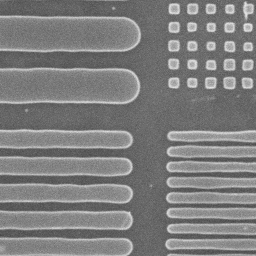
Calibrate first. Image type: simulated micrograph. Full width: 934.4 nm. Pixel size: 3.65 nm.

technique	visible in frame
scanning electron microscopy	groups of lines, slits or small figures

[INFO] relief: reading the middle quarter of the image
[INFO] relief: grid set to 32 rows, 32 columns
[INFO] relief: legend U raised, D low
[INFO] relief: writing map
DDDDDDDDDDDDDDDDDDDDDDDDDDUUDDDU
DUUUUUUDDUUUUUUDDDDDDDDDDDDDDDDD
UUUUUUUUUUUUUUUUUDDDDDDDDDDDDDDD
UUUUUUUUUUUUUUUUUUDDDDDDDDDDDDDD
UUUUUUUUUUUUUUUUUUUDDDDDDDUUUDDU
UUUUUUUUUUUUUUUUUUUDDDDDDDUUUDDU
UUUUUUUUUUUUUUUUUUUDDDDDDDDDDDDD
UUUUUUUUUUUUUUUUUUDDDDDDDDDDDDDD
UUUUUUUUUUUUUUUUUUDDDDDDDDDDDDDD
UUUUUUUUUUUUUUUUDDDDDDDDDDDDDDDD
DDDDDDDDDDDDDDDDDDDDDDDDDDDDDDDD
DDDDDDDDDDDDDDDDDDDDDDDDDDDDDDDD
DDDDDDDDDDDDDDDDDDDDDDDDDDDDDDDD
DDDDDDDDDDDDDDDDDDDDDDDDDDDDDDDD
DDDDDDDDDDDDDDDDDDDDDDDDDDDDDDDD
DDDDDDDDDDDDDDDDDDDDDDDDDDDDDDDD
DDDDDDDDDDDDDDDDDDDDDDDDDDDDDDDD
UUUUUUUUUUUUUUUUDDDDDDDDDDUUUUUU
UUUUUUUUUUUUUUUUUDDDDDDDDDUUUUUU
UUUUUUUUUUUUUUUUUDDDDDDDDDDDDDDD
UUUUUUUUUUUUUUUUDDDDDDDDDDDDDDDD
DDDDDDDDDDDDDDDDDDDDDDDDDDUUUUUU
DDDDDDDDDDDDDDDDDDDDDDDDDDUUUUUU
DDDDDDDDDDDDDDDDDDDDDDDDDDDDDDDD
UUUUUUUUUUUUUUUUDDDDDDDDDDDDDDUU
UUUUUUUUUUUUUUUUUDDDDDDDDDUUUUUU
UUUUUUUUUUUUUUUUUDDDDDDDDDUUUUUU
UUUUUUUUUUUUUUUUDDDDDDDDDDDDDDDD
DDDDDDDDDDDDDDDDDDDDDDDDDDDDDDDD
DDDDDDDDDDDDDDDDDDDDDDDDDDUUUUUU
UUUDDDUUUUUUUUUDDDDDDDDDDDUUUUUU
UUUUUUUUUUUUUUUUUDDDDDDDDDDDDDDD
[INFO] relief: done